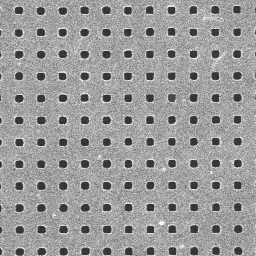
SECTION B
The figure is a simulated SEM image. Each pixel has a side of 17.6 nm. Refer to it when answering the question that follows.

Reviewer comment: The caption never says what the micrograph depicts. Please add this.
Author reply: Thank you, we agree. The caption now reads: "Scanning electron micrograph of a regular array of holes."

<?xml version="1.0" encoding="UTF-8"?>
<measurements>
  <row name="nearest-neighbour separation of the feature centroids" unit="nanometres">379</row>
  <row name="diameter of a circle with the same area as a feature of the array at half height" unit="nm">154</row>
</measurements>